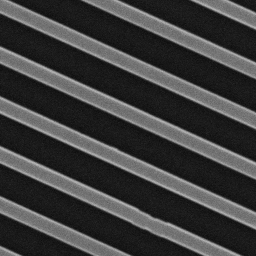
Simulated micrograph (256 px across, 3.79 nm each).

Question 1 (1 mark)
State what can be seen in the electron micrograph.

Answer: parallel lines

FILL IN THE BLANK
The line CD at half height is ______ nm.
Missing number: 54.4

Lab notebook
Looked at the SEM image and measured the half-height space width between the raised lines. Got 0.119 µm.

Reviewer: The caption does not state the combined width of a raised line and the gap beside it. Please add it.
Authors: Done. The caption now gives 172 nm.